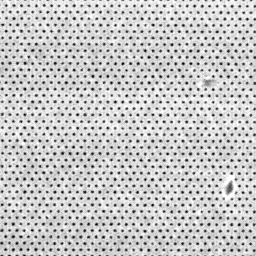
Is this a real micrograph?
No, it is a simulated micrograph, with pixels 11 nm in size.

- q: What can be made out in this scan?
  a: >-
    a regular array of holes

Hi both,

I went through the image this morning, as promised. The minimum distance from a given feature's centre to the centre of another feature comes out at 0.0788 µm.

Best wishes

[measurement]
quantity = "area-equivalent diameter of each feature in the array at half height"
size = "4.07 px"